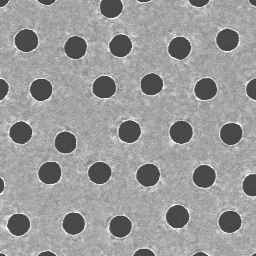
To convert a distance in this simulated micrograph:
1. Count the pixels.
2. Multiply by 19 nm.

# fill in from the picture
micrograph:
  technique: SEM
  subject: a regular array of holes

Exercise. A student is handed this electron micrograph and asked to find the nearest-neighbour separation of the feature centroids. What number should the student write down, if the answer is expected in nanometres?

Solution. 903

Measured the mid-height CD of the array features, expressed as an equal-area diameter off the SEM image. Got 433 nanometres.